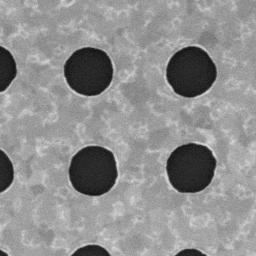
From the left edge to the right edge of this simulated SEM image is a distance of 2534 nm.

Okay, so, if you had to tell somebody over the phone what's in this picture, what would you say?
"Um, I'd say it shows holes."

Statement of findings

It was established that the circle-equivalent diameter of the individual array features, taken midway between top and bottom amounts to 506 nm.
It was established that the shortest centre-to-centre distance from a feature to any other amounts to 0.956 micrometres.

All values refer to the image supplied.